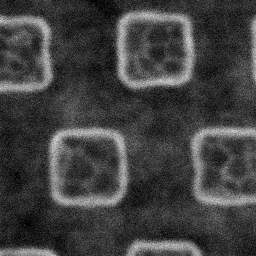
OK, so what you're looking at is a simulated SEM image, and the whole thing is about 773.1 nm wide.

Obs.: raised bodies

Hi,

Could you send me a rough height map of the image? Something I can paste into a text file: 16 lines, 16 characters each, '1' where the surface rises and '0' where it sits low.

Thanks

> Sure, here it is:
0000000000000000
1100000011110000
1110000011110000
1110000011110000
1110000011110000
0000000000000000
0000000000000000
0000000000000000
0000111000000111
0001111100001111
0001111100001111
0001111100001111
0000111000000111
0000000000000000
0000000000000000
0000000001110000